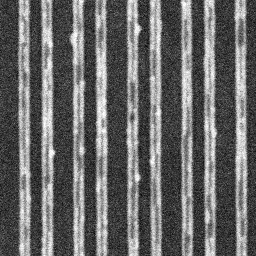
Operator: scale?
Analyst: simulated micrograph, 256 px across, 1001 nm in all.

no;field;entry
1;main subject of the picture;parallel lines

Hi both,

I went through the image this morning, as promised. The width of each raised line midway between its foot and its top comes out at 34.7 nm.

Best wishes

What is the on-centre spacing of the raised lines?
106 nanometers